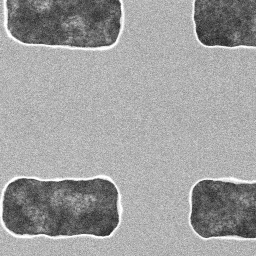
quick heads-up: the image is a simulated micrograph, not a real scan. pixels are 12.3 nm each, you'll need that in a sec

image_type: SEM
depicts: holes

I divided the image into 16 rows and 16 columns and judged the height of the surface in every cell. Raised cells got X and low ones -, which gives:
--------XXXX----
--------XXXX----
X------XXXXXX---
XXXXXXXXXXXXXXXX
XXXXXXXXXXXXXXXX
XXXXXXXXXXXXXXXX
XXXXXXXXXXXXXXXX
XXXXXXXXXXXXXXXX
XXXXXXXXXXXXXXXX
XXXXXXXXXXXXXXXX
XXXXXXXXXXXXXXXX
X------XXXXX----
-------XXXXX----
-------XXXXX----
X------XXXXX----
XXXXXXXXXXXXXXXX